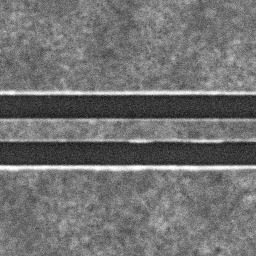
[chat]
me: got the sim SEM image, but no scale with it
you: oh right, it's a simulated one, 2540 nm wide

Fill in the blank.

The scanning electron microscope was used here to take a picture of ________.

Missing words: lines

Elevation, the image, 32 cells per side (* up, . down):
********************************
********************************
********************************
********************************
********************************
********************************
********************************
********************************
********************************
********************************
********************************
********************************
................................
................................
................................
********************************
********************************
********************************
................................
................................
................................
********************************
********************************
********************************
********************************
********************************
********************************
********************************
********************************
********************************
********************************
********************************